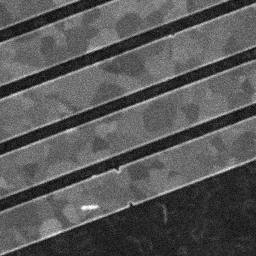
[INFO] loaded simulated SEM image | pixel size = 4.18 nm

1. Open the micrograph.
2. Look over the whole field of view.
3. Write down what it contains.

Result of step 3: parallel lines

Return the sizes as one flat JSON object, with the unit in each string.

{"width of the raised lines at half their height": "0.166 micrometres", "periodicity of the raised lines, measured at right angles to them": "221 nanometres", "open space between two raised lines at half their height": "55.4 nanometers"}